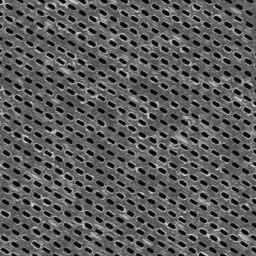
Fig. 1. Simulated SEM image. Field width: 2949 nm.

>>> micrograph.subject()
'a regular array of holes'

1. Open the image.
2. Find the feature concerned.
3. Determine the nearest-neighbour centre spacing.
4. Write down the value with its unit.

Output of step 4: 134 nanometres